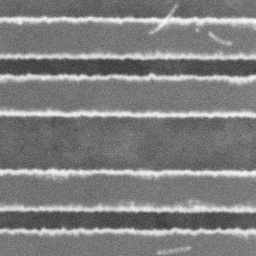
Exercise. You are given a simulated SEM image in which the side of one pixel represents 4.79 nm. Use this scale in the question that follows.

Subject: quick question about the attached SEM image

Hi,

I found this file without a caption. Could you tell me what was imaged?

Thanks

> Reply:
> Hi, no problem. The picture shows lines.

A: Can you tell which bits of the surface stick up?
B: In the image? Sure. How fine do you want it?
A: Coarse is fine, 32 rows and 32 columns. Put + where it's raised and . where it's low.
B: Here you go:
................................
................................
++++++++++++++++++++++++++++++++
++++++++++++++++++++++++++++++++
++++++++++++++++++++++++++++++++
++++++++++++++++++++++++++++++++
++++++++++++++++++++++++++++++++
................................
................................
+..+++.++.+...++................
++++++++++++++++++++++++++++++++
++++++++++++++++++++++++++++++++
++++++++++++++++++++++++++++++++
++++++++++++++++++++++++++++++++
........++..+...++++++++++++++++
................................
................................
................................
................................
................................
................................
++++++++++++++++++..++++.+.++...
++++++++++++++++++++++++++++++++
++++++++++++++++++++++++++++++++
++++++++++++++++++++++++++++++++
++++++++++++++++++++++++++++++++
.......................+........
................................
................................
++++++++++++++++++++++++++++++++
++++++++++++++++++++++++++++++++
++++++++++++++++++++++++++++++++